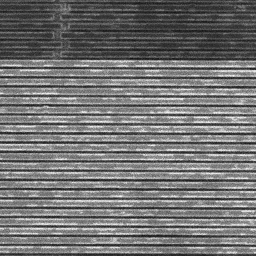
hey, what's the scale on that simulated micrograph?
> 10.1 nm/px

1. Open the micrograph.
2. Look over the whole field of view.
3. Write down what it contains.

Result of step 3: parallel lines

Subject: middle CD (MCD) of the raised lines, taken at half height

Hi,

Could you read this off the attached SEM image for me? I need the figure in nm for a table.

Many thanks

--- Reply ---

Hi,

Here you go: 59.4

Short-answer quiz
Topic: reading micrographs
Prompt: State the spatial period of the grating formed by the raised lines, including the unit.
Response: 94.3 nm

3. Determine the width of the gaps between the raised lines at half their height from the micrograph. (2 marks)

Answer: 0.0291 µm